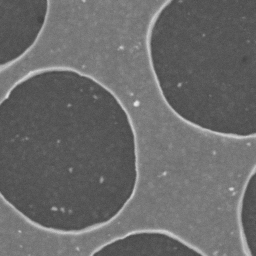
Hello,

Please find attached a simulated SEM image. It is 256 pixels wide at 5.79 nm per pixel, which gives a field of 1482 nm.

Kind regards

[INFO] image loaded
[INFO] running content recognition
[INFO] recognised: holes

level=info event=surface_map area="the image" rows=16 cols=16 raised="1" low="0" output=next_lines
0001111111000000
0001111111000000
0011111110000000
0111111110000000
1110011111000000
1000000111000000
0000000111100000
0000000011110000
0000000011111111
0000000011111111
0000000001111111
0000000011111110
0000000011111110
1100000111111110
1111011111111110
1111110000001110